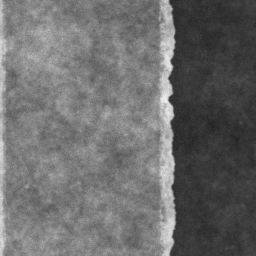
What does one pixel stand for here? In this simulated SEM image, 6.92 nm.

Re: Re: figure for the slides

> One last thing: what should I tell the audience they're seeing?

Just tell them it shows one or a few lines or trenches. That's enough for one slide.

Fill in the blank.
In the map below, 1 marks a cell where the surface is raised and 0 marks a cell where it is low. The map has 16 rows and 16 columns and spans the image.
1111111111000000
1111111111100000
1111111111100000
1111111111100000
1111111111100000
1111111111000000
1111111111000000
1111111111100000
1111111111000000
1111111111100000
1111111111100000
1111111111000000
1111111111100000
1111111111100000
1111111111100000
1111111111000000